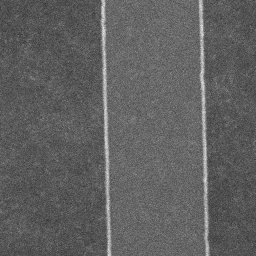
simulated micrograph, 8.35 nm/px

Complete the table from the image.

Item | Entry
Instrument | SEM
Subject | one or a few lines or trenches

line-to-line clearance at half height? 0.812 µm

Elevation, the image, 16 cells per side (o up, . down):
oooooo.......ooo
oooooo.......ooo
oooooo.......ooo
ooooooo......ooo
ooooooo......ooo
ooooooo......ooo
ooooooo......ooo
ooooooo......ooo
ooooooo......ooo
ooooooo......ooo
ooooooo......ooo
ooooooo......ooo
ooooooo......ooo
ooooooo......ooo
ooooooo......ooo
ooooooo......ooo